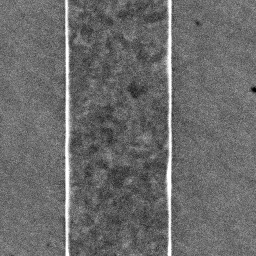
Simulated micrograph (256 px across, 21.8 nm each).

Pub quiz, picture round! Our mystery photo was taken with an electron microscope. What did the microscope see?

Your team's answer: wiring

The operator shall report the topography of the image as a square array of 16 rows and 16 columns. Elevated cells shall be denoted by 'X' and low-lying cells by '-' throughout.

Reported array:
----XXXXXXX-----
----XXXXXXX-----
----XXXXXXX-----
----XXXXXXX-----
----XXXXXXX-----
----XXXXXXX-----
----XXXXXXX-----
----XXXXXXX-----
----XXXXXXX-----
----XXXXXXX-----
----XXXXXXX-----
----XXXXXXX-----
----XXXXXXX-----
----XXXXXXX-----
----XXXXXXX-----
----XXXXXXX-----